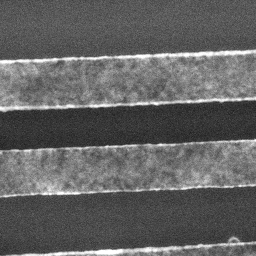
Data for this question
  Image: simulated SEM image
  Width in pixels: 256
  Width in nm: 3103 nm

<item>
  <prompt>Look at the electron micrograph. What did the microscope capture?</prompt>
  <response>lines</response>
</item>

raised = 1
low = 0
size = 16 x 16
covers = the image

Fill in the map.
0000000000000000
0000000000000000
0000000000000000
0000000011111111
1111111111111111
1111111111111111
1111111110000000
0000000000000000
0000000000000000
1111111111111111
1111111111111111
1111111111111111
0000000000000000
0000000000000000
0000000000000000
0000000000111111